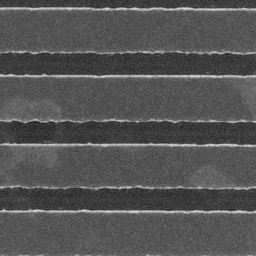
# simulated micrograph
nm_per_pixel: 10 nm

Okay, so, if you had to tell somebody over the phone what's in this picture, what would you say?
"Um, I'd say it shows lines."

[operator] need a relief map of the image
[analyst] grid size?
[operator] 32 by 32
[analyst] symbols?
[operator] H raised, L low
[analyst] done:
LLLLLLLLLLLLLLLLLLLLLLLLLLLLLLLL
HHHHHHHHHHHHHHHHHHHHHHHHHHHHHHHH
HHHHHHHHHHHHHHHHHHHHHHHHHHHHHHHH
HHHHHHHHHHHHHHHHHHHHHHHHHHHHHHHH
HHHHHHHHHHHHHHHHHHHHHHHHHHHHHHHH
HHHHHHHHHHHHHHHHHHHHHHHHHHHHHHHH
HHHHHHHHHHHHHHHHHLHHHLHHHHHHHHHH
LLLLLLLLLLLLLLLLLLLLLLLLLLLLLLLL
LLLLLLLLLLLLLLLLLLLLLLLLLLLLLLLL
HHHHHHHHHHHHHHHHHHHHHHHHHHHHHHHH
HHHHHHHHHHHHHHHHHHHHHHHHHHHHHHHH
HHHHHHHHHHHHHHHHHHHHHHHHHHHHHHHH
HHHHHHHHHHHHHHHHHHHHHHHHHHHHHHHH
HHHHHHHHHHHHHHHHHHHHHHHHHHHHHHHH
HHHHHHHHHHHHHHHHHHHHHHHHHHHHHHHH
LLLLLLLLLLLLLLLLLLLLLLLLLLLLLLLL
LLLLLLLLLLLLLLLLLLLLLLLLLLLLLLLL
LLLLLLLLLLLLLLLLLLLLLLLLLLLLLLLL
HHHHHHHHHHHHHHHHHHHHHHHHHHHHHHHH
HHHHHHHHHHHHHHHHHHHHHHHHHHHHHHHH
HHHHHHHHHHHHHHHHHHHHHHHHHHHHHHHH
HHHHHHHHHHHHHHHHHHHHHHHHHHHHHHHH
HHHHHHHHHHHHHHHHHHHHHHHHHHHHHHHH
LLLLLLLLLLLHLLLLLLHHLLLLLLHHHHHL
LLLLLLLLLLLLLLLLLLLLLLLLLLLLLLLL
LLLLLLLLLLLLLLLLLLLLLLLLLLLLLLLL
HHHHHHHHHHHHHHHHHHHHHHHHHHHHHHHL
HHHHHHHHHHHHHHHHHHHHHHHHHHHHHHHH
HHHHHHHHHHHHHHHHHHHHHHHHHHHHHHHH
HHHHHHHHHHHHHHHHHHHHHHHHHHHHHHHH
HHHHHHHHHHHHHHHHHHHHHHHHHHHHHHHH
HHHHHHHHHHHHHHHHHHHHHHHHHHHHHHHH